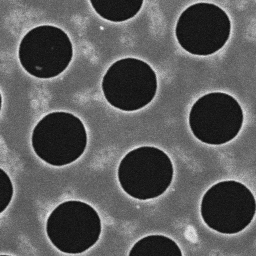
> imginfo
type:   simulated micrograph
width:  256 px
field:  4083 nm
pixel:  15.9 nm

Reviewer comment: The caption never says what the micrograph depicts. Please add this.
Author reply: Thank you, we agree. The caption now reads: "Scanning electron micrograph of holes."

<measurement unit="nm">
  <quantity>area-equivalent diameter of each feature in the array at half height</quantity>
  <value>865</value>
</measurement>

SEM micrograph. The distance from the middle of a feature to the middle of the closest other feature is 1420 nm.